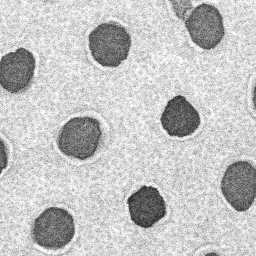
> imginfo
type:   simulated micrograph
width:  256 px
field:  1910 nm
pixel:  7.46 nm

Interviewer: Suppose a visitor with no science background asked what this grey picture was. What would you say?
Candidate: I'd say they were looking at holes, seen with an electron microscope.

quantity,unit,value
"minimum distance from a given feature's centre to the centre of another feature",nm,710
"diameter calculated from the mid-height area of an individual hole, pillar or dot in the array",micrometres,0.324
